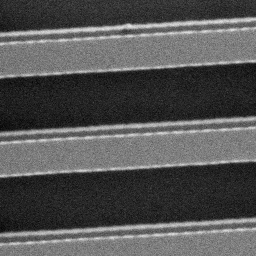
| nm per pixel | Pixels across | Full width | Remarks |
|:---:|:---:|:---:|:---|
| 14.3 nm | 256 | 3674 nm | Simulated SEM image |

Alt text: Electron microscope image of lines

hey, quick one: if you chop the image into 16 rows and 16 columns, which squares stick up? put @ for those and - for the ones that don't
----------------
------------@@@@
@@@@@@@@@@@@@@@@
@@@@@@@@@@@@@@@@
@@@@@@----------
----------------
----------------
---------------@
@@@@@@@@@@@@@@@@
@@@@@@@@@@@@@@@@
@@@@@@@@@-------
----------------
----------------
----------------
----@@@@@@@@@@@@
@@@@@@@@@@@@@@@@